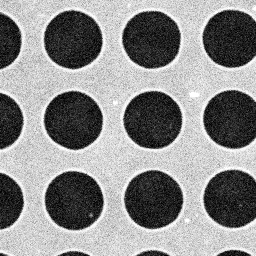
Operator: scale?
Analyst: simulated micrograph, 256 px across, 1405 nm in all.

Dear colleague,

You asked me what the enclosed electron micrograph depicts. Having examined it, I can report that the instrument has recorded holes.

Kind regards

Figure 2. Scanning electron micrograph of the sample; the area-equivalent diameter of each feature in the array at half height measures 326 nm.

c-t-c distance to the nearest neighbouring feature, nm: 435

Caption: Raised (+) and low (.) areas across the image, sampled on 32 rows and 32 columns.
++++++++++++++++++++++++++++++++
++++++++..++++++++..+++++++...++
..++++......++++......++++......
..++++.......++.......++++......
...++........++........++.......
...++........++........++.......
..++++.......+++......++++......
..++++......++++......++++......
.+++++++..++++++++..+++++++++.++
++++++++++++++++++++++++++++++++
++++++++++++++++++++++++++++++++
++++++++..++++++++..++++++++..++
..++++......++++......++++......
...+++.......+++......++++......
...+++.......++........++.......
...+++.......++........++.......
...+++.......+++.......+++......
..+++++.....++++......+++++.....
.+++++++...+++++++...+++++++..++
++++++++++++++++++++++++++++++++
++++++++++++++++++++++++++++++++
++++++++..++++++++..+++++++....+
..+++++.....++++......++++......
...+++.......+++.......+++......
...+++.......++........++.......
...+++.......+++.......++.......
...+++.......+++.......+++......
..++++......++++......+++++.....
.+++++++...+++++++..++++++++++++
++++++++++++++++++++++++++++++++
++++++++++++++++++++++++++++++++
++++++++..++++++++...+++++++...+